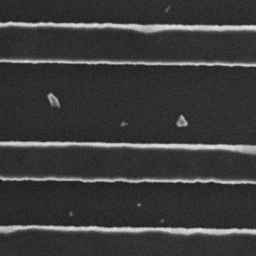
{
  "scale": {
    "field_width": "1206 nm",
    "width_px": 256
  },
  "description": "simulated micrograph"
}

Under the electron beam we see lines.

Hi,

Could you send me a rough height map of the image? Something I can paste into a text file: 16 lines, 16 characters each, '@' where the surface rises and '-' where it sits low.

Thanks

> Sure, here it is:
----------------
@@--------------
@@@@@@@@@@@@@@@@
@@@@@@@@@@@@@@@@
----------------
----------------
----------------
----------------
----------------
@@@@@@@@@@@@@@@@
@@@@@@@@@@@@@@@@
----------------
----------------
----------------
@@@@@@@@@@@@@@@@
@@@@@@@@@@@@@@@@